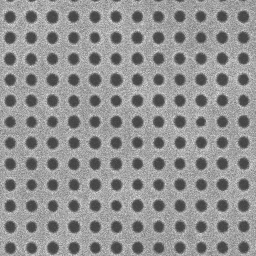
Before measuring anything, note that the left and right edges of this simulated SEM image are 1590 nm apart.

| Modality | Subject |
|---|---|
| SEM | a regular array of holes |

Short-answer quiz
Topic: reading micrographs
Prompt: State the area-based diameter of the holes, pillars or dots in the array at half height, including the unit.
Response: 0.0719 micrometres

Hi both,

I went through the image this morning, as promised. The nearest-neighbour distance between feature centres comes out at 0.13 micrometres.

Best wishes